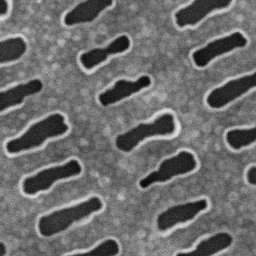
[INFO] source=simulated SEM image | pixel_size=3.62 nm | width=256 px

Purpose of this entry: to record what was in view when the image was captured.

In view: a regular array of holes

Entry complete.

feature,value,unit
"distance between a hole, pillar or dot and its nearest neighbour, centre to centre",161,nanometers